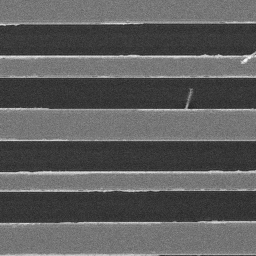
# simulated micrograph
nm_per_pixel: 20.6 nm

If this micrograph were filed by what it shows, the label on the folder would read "lines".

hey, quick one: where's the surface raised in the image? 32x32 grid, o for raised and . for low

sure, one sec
oooooooooooooooooooooooooooooooo
oooooooooooooooooooooooooooooooo
oooooooooooooooooooooooooooooooo
................................
................................
................................
................................
oooooooooooooooooooooooooooooooo
oooooooooooooooooooooooooooooooo
oooooooooooooooooooooooooooooooo
................................
................................
................................
................................
oooooooooooooooooooooooooooooooo
oooooooooooooooooooooooooooooooo
oooooooooooooooooooooooooooooooo
oooooooooooooooooooooooooooooooo
................................
................................
................................
..........................o..o.o
oooooooooooooooooooooooooooooooo
oooooooooooooooooooooooooooooooo
................................
................................
................................
................................
oooooooooooooooooooooooooooooooo
oooooooooooooooooooooooooooooooo
oooooooooooooooooooooooooooooooo
oooooooooooooooooooooooooooooooo